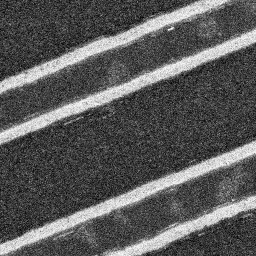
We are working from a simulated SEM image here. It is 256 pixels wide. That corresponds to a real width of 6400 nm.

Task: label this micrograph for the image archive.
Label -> one or a few lines or trenches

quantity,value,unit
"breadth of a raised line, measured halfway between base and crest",1.18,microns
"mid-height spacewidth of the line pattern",104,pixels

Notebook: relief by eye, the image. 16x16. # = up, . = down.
............####
..........######
........#######.
.....########...
...#######......
########........
#####...........
###.............
................
...............#
.............###
..........######
........########
.....########...
...########.....
#########.......